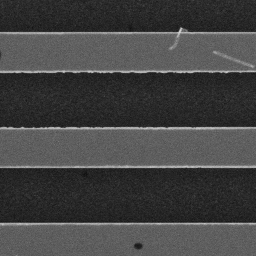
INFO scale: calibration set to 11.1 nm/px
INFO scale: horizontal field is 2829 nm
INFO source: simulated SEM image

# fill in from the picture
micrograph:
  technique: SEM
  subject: lines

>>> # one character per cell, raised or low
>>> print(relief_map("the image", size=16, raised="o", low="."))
................
................
oooooooooooooooo
oooooooooooooooo
ooooooooooooooo.
................
................
................
oooooooooooooooo
oooooooooooooooo
................
................
................
................
oooooooooooooooo
oooooooooooooooo